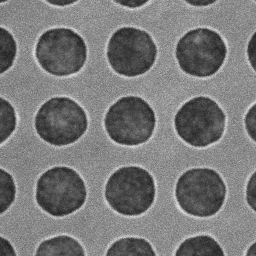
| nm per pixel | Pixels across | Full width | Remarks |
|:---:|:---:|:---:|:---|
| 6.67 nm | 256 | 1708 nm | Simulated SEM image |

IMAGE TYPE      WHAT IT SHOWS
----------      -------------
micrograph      a regular array of holes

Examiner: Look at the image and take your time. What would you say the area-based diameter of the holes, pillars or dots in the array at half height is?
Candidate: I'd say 336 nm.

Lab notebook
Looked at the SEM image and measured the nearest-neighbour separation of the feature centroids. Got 464 nanometers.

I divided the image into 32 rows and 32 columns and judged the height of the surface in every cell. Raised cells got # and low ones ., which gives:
######...######...######...#####
################################
################################
#######.#######..########.######
..###.....####.....####.....###.
..###......##......###......###.
..##.......##.......##......###.
..###......##......###......###.
.####.....####.....####.....####
#######.########.#######..######
################################
################################
.#####...######...######...#####
..###.....####.....####.....###.
..##.......##......###......###.
..##.......##......###......###.
..###......##......###......###.
.####.....####....#####....#####
################################
################################
################################
.#####....####....#####....#####
..###.....####.....###......###.
..##.......##......###......###.
..##.......##......###......###.
.####.....####.....###......###.
.#####...######...#####....#####
################################
################################
#######..################.######
.####.....####.....####....#####
..##.......##......###......###.